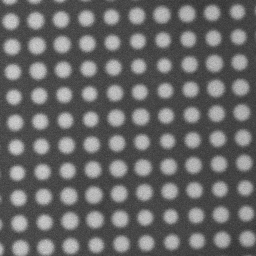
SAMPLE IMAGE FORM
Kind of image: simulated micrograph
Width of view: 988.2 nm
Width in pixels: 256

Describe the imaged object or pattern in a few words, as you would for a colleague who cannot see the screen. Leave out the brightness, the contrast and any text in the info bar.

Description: an array of small figures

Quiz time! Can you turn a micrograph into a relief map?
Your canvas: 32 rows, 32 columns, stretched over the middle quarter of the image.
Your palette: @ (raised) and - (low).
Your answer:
@@--@@@@---@@@---@@@---@@@@---@@
@@--@@@@---@@@---@@@----@@----@@
@----@@----@@@------------------
--------------------------------
--------------------------------
------------@@----@@----@@@---@@
@----@@@---@@@@--@@@@--@@@@---@@
@@---@@@---@@@@--@@@@---@@@---@@
@@---@@@---@@@----@@------------
@-------------------------------
--------------------------------
------------------@@----@@@---@@
@----@@@---@@@@--@@@@---@@@---@@
@@---@@@---@@@@--@@@@---@@@---@@
@@---@@@---@@@@---@@@---@@@----@
@@----@@------------------------
--------------------------------
-------------------------@-----@
@-----@@----@@@---@@@---@@@---@@
@@@--@@@@--@@@@---@@@---@@@@--@@
@@@--@@@@--@@@@---@@@----@@----@
@@----@@----@@------------------
--------------------------------
--------------------------------
-------@----@@@---@@@----@@@---@
@@----@@@---@@@---@@@@--@@@@--@@
@@@--@@@@---@@@@--@@@@--@@@@---@
@@@---@@@---@@@---@@@----@@-----
@@------------------------------
--------------------------------
-------------@@----@@----@@@---@
@@@---@@@---@@@@--@@@@--@@@@---@